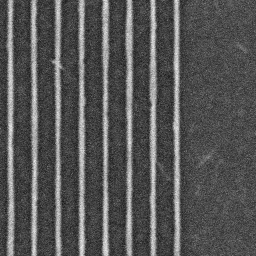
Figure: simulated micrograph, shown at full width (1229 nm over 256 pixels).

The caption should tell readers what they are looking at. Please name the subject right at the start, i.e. parallel lines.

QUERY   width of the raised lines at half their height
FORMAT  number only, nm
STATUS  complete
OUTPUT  17.4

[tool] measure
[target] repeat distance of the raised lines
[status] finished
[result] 114 nm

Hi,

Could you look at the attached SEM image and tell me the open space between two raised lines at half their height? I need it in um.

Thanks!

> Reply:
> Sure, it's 0.0959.